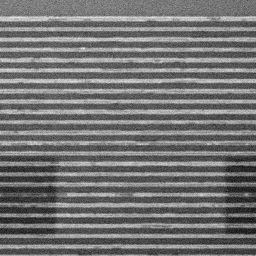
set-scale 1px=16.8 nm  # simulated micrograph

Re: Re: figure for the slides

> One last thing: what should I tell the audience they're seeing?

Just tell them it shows parallel lines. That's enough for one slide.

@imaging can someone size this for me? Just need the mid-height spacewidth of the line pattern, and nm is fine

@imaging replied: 135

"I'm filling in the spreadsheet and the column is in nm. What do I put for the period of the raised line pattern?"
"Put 174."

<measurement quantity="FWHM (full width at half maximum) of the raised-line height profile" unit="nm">44.2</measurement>